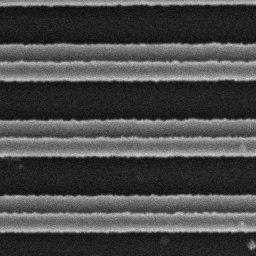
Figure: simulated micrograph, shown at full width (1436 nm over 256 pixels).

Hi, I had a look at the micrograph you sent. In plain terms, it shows lines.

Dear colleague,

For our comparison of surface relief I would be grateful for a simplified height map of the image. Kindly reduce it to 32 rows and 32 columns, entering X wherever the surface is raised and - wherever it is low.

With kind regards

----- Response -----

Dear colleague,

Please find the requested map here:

XXXXXXXXXXXXXXXXXXXXXXX-XXX-----
--------------------------------
--------------------------------
--------------------------------
--------------------------------
--------------------------------
XXXXXXXXXXXXXXXXXXXXXXXXXXXXXXXX
XXXXXXXXXXXXXXXXXXXXXXXXXXXXXXXX
XXXXXXXXXXXXXXXXXXXXXXXXXXXXXXXX
XXXXXXXXXXXXXXXXXXXXXXXXXXXXXXXX
--------------------------------
--------------------------------
--------------------------------
--------------------------------
--------------------------------
XXXXXXXXXXXXXXXXXXXXXXXXXXXXXXXX
XXXXXXXXXXXXXXXXXXXXXXXXXXXXXXXX
XXXXXXXXXXXXXXXXXXXXXXXXXXXXXXXX
XXXXXXXXXXXXXXXXXXXXXXXXXXXXXXXX
XXXXXXXXXXX-XX--XXXXX--X-----XXX
--------------------------------
--------------------------------
--------------------------------
--------------------------------
--XXXXXXX---XX---X-X-XXXXXXXXXXX
XXXXXXXXXXXXXXXXXXXXXXXXXXXXXXXX
XXXXXXXXXXXXXXXXXXXXXXXXXXXXXXXX
XXXXXXXXXXXXXXXXXXXXXXXXXXXXXXXX
XXXXXXXXXXXXXXXXXXXXXXXXXXXXXXXX
--------------------------------
--------------------------------
--------------------------------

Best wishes